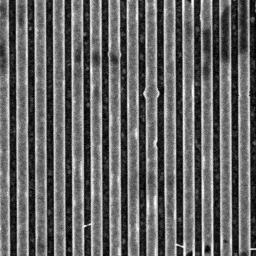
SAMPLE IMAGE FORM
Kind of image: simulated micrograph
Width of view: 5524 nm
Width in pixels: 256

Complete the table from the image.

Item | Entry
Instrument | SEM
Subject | parallel lines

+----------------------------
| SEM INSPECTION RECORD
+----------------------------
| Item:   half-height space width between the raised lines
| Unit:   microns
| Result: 0.167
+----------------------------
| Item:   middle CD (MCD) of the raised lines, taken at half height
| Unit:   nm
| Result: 232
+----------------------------